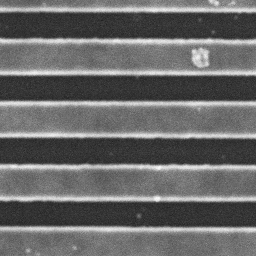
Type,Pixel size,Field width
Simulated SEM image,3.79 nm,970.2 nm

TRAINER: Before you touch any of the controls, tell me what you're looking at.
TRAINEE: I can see lines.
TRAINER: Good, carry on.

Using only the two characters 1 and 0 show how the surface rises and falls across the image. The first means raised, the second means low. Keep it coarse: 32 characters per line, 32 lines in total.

11111111111111111111111111111111
00000000000000000000000000000000
00000000000000000000000000000000
00000000000000000000000000000000
00000000000000000000000000000000
11111111111111111111111111111111
11111111111111111111111111111111
11111111111111111111111111111111
11111111111111111111111111111111
00000000000000000000000000000000
00000000000000000000000000000000
00000000000000000000000000000000
00000000000000000000000000000000
11111111111111111111111111111111
11111111111111111111111111111111
11111111111111111111111111111111
11111111111111111111111111111111
00000000000000000000000000000000
00000000000000000000000000000000
00000000000000000000000000000000
00000000000000000000000000000000
11111111111111111111111111111111
11111111111111111111111111111111
11111111111111111111111111111111
11111111111111111111111111111111
00000000000000000000000000000000
00000000000000000000000000000000
00000000000000000000000000000000
11111111111111111111111111111111
11111111111111111111111111111111
11111111111111111111111111111111
11111111111111111111111111111111